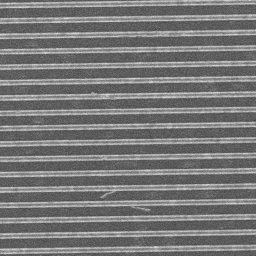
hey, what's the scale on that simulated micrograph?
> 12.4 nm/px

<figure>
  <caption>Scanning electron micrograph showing parallel lines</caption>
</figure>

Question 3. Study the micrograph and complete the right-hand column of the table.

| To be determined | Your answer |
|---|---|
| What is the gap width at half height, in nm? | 138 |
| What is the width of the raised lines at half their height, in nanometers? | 52.6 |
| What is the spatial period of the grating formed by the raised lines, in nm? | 190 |